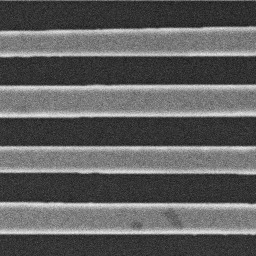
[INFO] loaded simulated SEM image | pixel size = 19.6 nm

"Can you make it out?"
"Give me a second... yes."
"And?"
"lines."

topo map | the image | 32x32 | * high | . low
................................
................................
................................
.........................*******
********************************
********************************
********************************
................................
................................
................................
................................
********************************
********************************
********************************
******************************..
................................
................................
................................
********************************
********************************
********************************
..........**********************
................................
................................
................................
*******************************.
********************************
********************************
********************************
................................
................................
................................